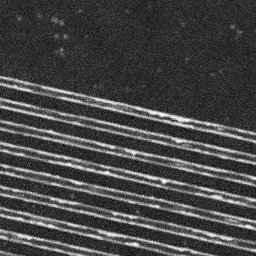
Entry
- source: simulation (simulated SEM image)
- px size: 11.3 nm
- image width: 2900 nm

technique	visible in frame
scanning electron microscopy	parallel lines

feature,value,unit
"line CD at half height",99.5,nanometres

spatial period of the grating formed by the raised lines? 242 nm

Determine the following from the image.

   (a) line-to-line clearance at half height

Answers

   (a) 0.149 µm